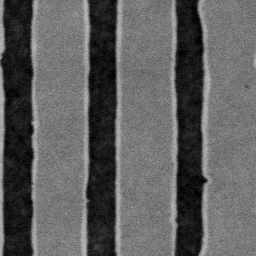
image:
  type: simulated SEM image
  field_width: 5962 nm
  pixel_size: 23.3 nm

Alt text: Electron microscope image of one or a few lines or trenches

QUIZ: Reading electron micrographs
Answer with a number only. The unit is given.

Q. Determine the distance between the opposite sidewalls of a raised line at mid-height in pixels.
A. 53.9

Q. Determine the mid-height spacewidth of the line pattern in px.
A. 31.7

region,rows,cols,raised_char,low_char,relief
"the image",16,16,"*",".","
..***..****.****
..***..****..***
..***..****..***
..***..****..***
..***..****..***
..***..****..***
..***..****..***
..***..****..***
..***..****..***
..***..****..***
..***..****..***
..***..****..***
..***..****..***
..***..****..***
..***..****..***
..***..****..***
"